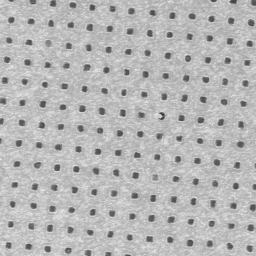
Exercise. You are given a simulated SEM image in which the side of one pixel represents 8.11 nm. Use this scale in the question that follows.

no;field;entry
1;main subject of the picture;a regular array of holes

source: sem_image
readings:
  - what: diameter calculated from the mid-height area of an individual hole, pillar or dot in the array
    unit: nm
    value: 57.9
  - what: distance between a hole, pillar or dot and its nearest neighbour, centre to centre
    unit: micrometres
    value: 0.159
